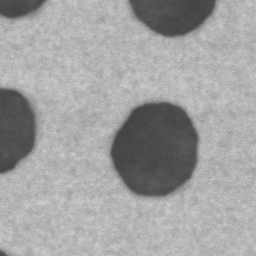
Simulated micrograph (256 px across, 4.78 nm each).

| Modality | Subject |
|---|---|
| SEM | holes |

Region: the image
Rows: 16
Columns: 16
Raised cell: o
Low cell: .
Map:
...ooooo.....ooo
ooooooooo....ooo
oooooooooooooooo
oooooooooooooooo
oooooooooooooooo
oooooooooooooooo
..ooooooo..ooooo
..oooooo....oooo
..ooooo.....oooo
..ooooo.....oooo
.oooooo.....oooo
oooooooo...ooooo
oooooooooooooooo
oooooooooooooooo
oooooooooooooooo
oooooooooooooooo